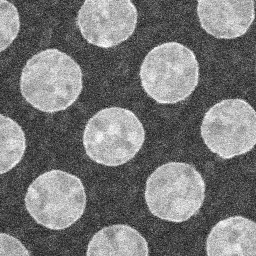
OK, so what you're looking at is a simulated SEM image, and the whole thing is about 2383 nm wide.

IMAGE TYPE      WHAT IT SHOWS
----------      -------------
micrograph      raised bodies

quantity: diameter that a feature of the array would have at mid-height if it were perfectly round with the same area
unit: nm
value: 541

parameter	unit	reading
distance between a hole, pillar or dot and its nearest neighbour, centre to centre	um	0.773